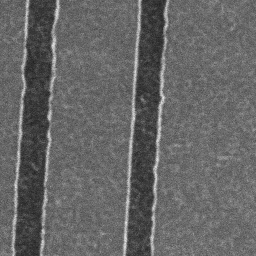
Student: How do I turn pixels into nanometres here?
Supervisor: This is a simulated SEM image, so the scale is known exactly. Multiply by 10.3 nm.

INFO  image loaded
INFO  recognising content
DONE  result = one or a few lines or trenches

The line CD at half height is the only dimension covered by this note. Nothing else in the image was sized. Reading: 290 nm